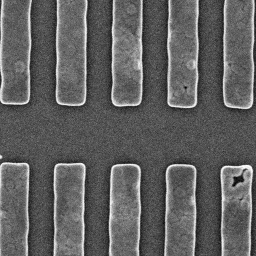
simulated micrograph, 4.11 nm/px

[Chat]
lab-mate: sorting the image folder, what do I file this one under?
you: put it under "groups of lines, slits or small figures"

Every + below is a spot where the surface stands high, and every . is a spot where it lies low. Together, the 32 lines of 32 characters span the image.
++++...++++...++++...++++...++++
++++...++++...++++...++++...++++
++++...++++...++++...++++...++++
++++...++++...++++...++++...++++
++++...++++...++++...++++...++++
++++...++++...++++...++++...++++
++++...++++...++++...++++...++++
++++...++++...++++...++++...++++
++++...++++...++++...++++...++++
++++...++++...++++...++++...++++
++++...++++...++++...++++...++++
++++...++++...++++...++++...++++
++++...++++...++++...+++....++++
..............................+.
................................
................................
................................
................................
................................
................................
+++....+++......................
++++...++++...+++....+++....++..
++++...++++...+++....+++....+...
++++...+++....+++....+++....+++.
++++...+++....+++....+++....+++.
+++....+++....++++...+++....+++.
+++....+++....++++...+++....+++.
++++...+++....+++....+++....+++.
++++...+++....+++....+++....+++.
+++....+++....+++....+++....+++.
+++....+++....+++....+++....+++.
+++....+++....+++....+++....+++.